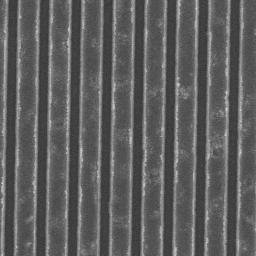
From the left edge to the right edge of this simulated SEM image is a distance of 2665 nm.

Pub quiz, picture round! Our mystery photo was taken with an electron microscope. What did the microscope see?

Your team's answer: parallel lines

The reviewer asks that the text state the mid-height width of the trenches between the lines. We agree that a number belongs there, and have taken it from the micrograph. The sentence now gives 122 nm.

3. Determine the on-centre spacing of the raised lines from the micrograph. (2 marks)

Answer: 331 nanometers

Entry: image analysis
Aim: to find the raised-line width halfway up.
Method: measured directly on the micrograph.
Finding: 216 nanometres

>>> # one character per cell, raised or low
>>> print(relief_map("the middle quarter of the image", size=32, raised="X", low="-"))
X---XXXXX---XXXXX---XXXXX---XXXX
X---XXXXX---XXXXX---XXXXX---XXXX
X---XXXXX---XXXXX---XXXXX---XXXX
X---XXXXX---XXXXX---XXXXX---XXXX
X---XXXXX---XXXXX---XXXXX---XXXX
X---XXXXX---XXXXX---XXXXX---XXXX
X---XXXXX---XXXXX---XXXXX---XXXX
X---XXXXX---XXXXX---XXXXX---XXXX
X---XXXXX---XXXXX---XXXXX---XXXX
X---XXXXX---XXXXX---XXXXX---XXXX
X---XXXXX---XXXXX---XXXXX---XXXX
X---XXXXX---XXXXX---XXXXX---XXXX
X---XXXXX---XXXXX---XXXXX---XXXX
X---XXXXX---XXXXX---XXXXX---XXXX
X---XXXXX---XXXXX---XXXXX---XXXX
X---XXXXX---XXXXX---XXXXX---XXXX
X---XXXXX---XXXXX---XXXXX---XXXX
X---XXXXX---XXXXX---XXXXX---XXXX
X---XXXXX---XXXXX---XXXXX---XXXX
X---XXXXX---XXXXX---XXXXX---XXXX
X---XXXXX---XXXXX---XXXXX---XXXX
X---XXXXX---XXXXX---XXXXX---XXXX
X---XXXXX---XXXXX---XXXXX---XXXX
X---XXXXX---XXXXX---XXXXX---XXXX
X---XXXXX---XXXXX---XXXXX---XXXX
X---XXXXX---XXXXX---XXXXX---XXXX
X---XXXXX---XXXXX---XXXXX---XXXX
X---XXXXX---XXXXX---XXXXX---XXXX
X---XXXXX---XXXXX---XXXXX---XXXX
X---XXXXX---XXXXX---XXXXX---XXXX
X---XXXXX---XXXXX---XXXXX---XXXX
X---XXXXX---XXXXX---XXXXX---XXXX